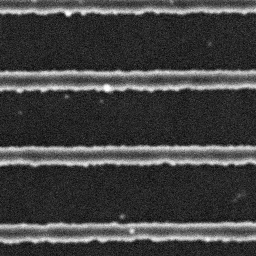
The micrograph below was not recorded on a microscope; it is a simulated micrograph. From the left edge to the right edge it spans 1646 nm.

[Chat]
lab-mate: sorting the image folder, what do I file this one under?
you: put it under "lines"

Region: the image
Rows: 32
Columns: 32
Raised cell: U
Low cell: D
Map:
UUUUUUUUUUUUUUUUUUUUUUUUUUUUUUUU
UUUUUUUDUUUUUUUUUUDUUUUUDDUUUUUD
DDDDDDDDDDDDDDDDDDDDDDDDDDDDDDDD
DDDDDDDDDDDDDDDDDDDDDDDDDDDDDDDD
DDDDDDDDDDDDDDDDDDDDDDDDDDDDDDDD
DDDDDDDDDDDDDDDDDDDDDDDDDDDDDDDD
DDDDDDDDDDDDDDDDDDDDDDDDDDDDDDDD
DDDDDDDDDDDDDDDDDDDDDDDDDDDDDDDD
DDDDDDDDDDDDDDDDDDDDDDDDDDDDDDDD
UUUUUUUUUUUUUUUUUUUUUUUUUUUUUUUU
UUUUUUUUUUUUUUUUUUUUUUUUUUUUUUUU
DDDDDDDDDDDDDDDDDDDDDDDDDDDDDDDD
DDDDDDDDDDDDDDDDDDDDDDDDDDDDDDDD
DDDDDDDDDDDDDDDDDDDDDDDDDDDDDDDD
DDDDDDDDDDDDDDDDDDDDDDDDDDDDDDDD
DDDDDDDDDDDDDDDDDDDDDDDDDDDDDDDD
DDDDDDDDDDDDDDDDDDDDDDDDDDDDDDDD
DDDDDDDDDDDDDDDDDDDDDDDDDDDDDDDD
DUUUUUUUDUUUUUUUUUUUUUUUUUUUUUUU
UUUUUUUUUUUUUUUUUUUUUUUUUUUUUUUU
UDDDUDDDUUUDDDDDDDDDDDDDDDDDDDDD
DDDDDDDDDDDDDDDDDDDDDDDDDDDDDDDD
DDDDDDDDDDDDDDDDDDDDDDDDDDDDDDDD
DDDDDDDDDDDDDDDDDDDDDDDDDDDDDDDD
DDDDDDDDDDDDDDDDDDDDDDDDDDDDDDDD
DDDDDDDDDDDDDDDDDDDDDDDDDDDDDDDD
DDDDDDDDDDDDDDDDDDDDDDDDDDDDDDDD
DDDDDDDDDDDDDDDDDDDDDDDDDDDDDDDD
UUUUUUUUUUUUUUUUUUUUUUUUUUUUUUUU
UUUUUUUUUUUUUUUUUUUUUUUUUUUUUUUU
DDDDDDDDDDDDDDDDDDDDDDDDDDDDDDDD
DDDDDDDDDDDDDDDDDDDDDDDDDDDDDDDD